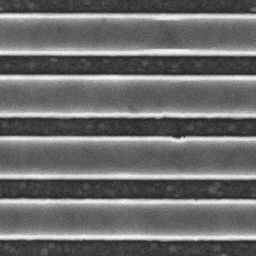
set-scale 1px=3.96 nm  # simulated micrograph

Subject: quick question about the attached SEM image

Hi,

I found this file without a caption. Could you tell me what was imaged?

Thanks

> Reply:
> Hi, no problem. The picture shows one or a few lines or trenches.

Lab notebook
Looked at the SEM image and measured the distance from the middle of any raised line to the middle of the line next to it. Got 0.244 micrometres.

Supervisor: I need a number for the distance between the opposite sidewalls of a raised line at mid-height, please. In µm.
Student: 0.153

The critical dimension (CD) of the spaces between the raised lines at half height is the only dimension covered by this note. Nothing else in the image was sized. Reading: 92.7 nm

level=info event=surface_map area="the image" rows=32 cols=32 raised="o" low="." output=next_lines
................................
................................
oooooooooooooooooooooooooooooooo
oooooooooooooooooooooooooooooooo
oooooooooooooooooooooooooooooooo
oooooooooooooooooooooooooooooooo
oooooooooooooooooooooooooooooooo
................................
................................
................................
oooooooooooooooooooooooooooooooo
oooooooooooooooooooooooooooooooo
oooooooooooooooooooooooooooooooo
oooooooooooooooooooooooooooooooo
................oo....o.ooo...o.
................................
................................
oooooooooooooooooooooooooooooooo
oooooooooooooooooooooooooooooooo
oooooooooooooooooooooooooooooooo
oooooooooooooooooooooooooooooooo
oooooooooooooooooooooooooooooooo
................................
................................
................................
oooooooooooooooooooooooooooooooo
oooooooooooooooooooooooooooooooo
oooooooooooooooooooooooooooooooo
oooooooooooooooooooooooooooooooo
oooooooooooooooooooooooooooooooo
................................
................................